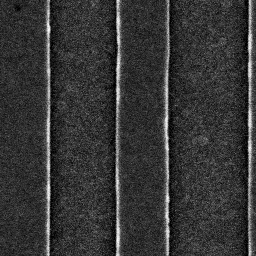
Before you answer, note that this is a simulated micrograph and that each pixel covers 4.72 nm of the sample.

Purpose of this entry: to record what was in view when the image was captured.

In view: one or a few lines or trenches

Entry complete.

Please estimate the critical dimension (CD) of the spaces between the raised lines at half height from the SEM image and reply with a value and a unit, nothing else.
0.347 micrometres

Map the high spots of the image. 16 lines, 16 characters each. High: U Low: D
UUUDDDDUUUUDDDDD
UUUDDDDUUUUDDDDD
UUUDDDDUUUUDDDDD
UUUDDDDUUUUDDDDD
UUUDDDDUUUDDDDDD
UUUDDDDUUUDDDDDD
UUUDDDDUUUDDDDDD
UUUDDDDUUUUDDDDD
UUUDDDDUUUUDDDDD
UUUDDDDUUUUDDDDD
UUUDDDDUUUUDDDDD
UUUDDDDUUUUDDDDD
UUUDDDDUUUUDDDDD
UUUDDDDUUUUDDDDD
UUUDDDDUUUUDDDDD
UUUDDDDUUUDDDDDD